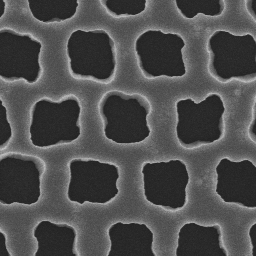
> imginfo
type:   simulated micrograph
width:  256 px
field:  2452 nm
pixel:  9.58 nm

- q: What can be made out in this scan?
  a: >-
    holes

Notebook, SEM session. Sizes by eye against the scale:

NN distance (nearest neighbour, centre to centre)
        670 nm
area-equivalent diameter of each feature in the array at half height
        471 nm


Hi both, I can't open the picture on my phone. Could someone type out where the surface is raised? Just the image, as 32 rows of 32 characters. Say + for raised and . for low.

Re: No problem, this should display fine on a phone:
.+++......+++.....++++......+++.
++++.....+++++....+++++.....+++.
+++++...++++++++++++++++++++++++
++++++++++++++++++++++++++++++++
...++++++.....++++....++++.....+
.....+++......+++......+++......
.....+++......+++......+++......
.....++++.....+++......+++......
.....++++.....++++.....++++.....
.....+++++++..+++++++..++++.....
++++++++++++++++++++++++++++++++
++++++++++++++++++++++++++++++++
++++++++.++++.....+++++.+...++++
.+++......+++.....++++......++++
.+++......+++.....++++......++++
.+++......+++.....++++......++++
.+++......+++......+++......+++.
.+++.....+++++....++++.....+++++
++++++++++++++++++++++++++++++++
+..+++++++++++++++++++++++++++++
.....++++.....++++.....++++.....
.....++++......+++.....++++.....
.....++++......+++......+++.....
.....++++......+++.....++++.....
.....++++.....++++.....+++++....
+++++++++++++++++++....+++++++..
++++++++++++++++++++++++++++++++
++++++++++++++++++++++++++++++++
+++++....+++++.....++++....++++.
++++.....+++++.....+++.....++++.
.++++....+++++.....+++.....+++++
.++++....+++++.....+++......++++